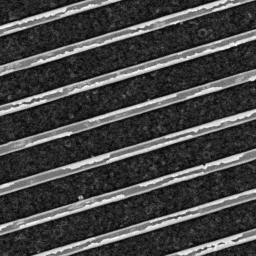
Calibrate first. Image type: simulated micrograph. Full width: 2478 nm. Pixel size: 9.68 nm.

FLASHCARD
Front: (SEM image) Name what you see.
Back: parallel lines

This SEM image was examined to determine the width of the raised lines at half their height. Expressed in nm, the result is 93.9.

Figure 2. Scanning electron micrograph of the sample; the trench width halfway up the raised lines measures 276 nanometres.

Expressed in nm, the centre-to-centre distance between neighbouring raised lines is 370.